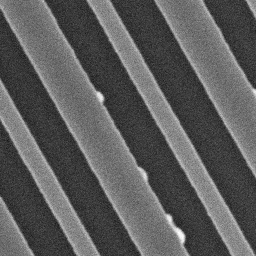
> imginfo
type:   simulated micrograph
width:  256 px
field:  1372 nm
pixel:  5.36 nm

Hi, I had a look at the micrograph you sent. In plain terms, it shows lines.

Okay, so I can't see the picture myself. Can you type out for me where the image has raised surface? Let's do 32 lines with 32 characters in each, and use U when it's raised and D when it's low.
UUUUUUDDDDDUUUDDDDDDUUUUUUDDDDDU
UUUUUUDDDDDDUUDDDDDDUUUUUUDDDDDD
DUUUUUUDDDDDUUUDDDDDDUUUUUUDDDDD
DUUUUUUDDDDDDUUUDDDDDUUUUUUDDDDD
DDUUUUUUDDDDDUUUDDDDDDUUUUUUDDDD
DDDUUUUUUDDDDDUUUDDDDDUUUUUUDDDD
DDDUUUUUUDDDDDDUUDDDDDDUUUUUUDDD
DDDDUUUUUUDDDDDUUUDDDDDDUUUUUDDD
DDDDUUUUUUDDDDDDUUUDDDDDUUUUUUDD
DDDDDUUUUUUDDDDDUUUDDDDDDUUUUUUD
DDDDDUUUUUUDDDDDDUUUDDDDDUUUUUUD
UDDDDDUUUUUUDDDDDUUUDDDDDDUUUUUU
UDDDDDDUUUUUUDDDDDUUUDDDDDUUUUUU
UUDDDDDUUUUUUDDDDDDUUDDDDDDUUUUU
UUUDDDDDUUUUUUDDDDDUUUDDDDDDUUUU
UUUDDDDDUUUUUUDDDDDDUUDDDDDDUUUU
DUUUDDDDDUUUUUUDDDDDUUUDDDDDDUUU
DDUUDDDDDUUUUUUDDDDDDUUUDDDDDUUU
DDUUUDDDDDUUUUUUDDDDDUUUDDDDDDUU
DDDUUDDDDDDUUUUUUDDDDDUUUDDDDDUU
DDDUUUDDDDDUUUUUUDDDDDUUUDDDDDDU
DDDDUUUDDDDDUUUUUUDDDDDUUUDDDDDD
DDDDUUUDDDDDUUUUUUDDDDDDUUDDDDDD
DDDDDUUUDDDDDUUUUUUDDDDDUUUDDDDD
DDDDDDUUDDDDDUUUUUUDDDDDDUUUDDDD
UDDDDDUUUDDDDDUUUUUUDDDDDUUUDDDD
UDDDDDDUUDDDDDDUUUUUUDDDDDUUUDDD
UUDDDDDUUUDDDDDUUUUUUDDDDDDUUDDD
UUDDDDDDUUUDDDDDUUUUUUDDDDDUUUDD
UUUDDDDDUUUDDDDDUUUUUUUDDDDDUUDD
UUUDDDDDDUUUDDDDDUUUUUUDDDDDUUUD
UUUUDDDDDUUUDDDDDUUUUUUDDDDDDUUU